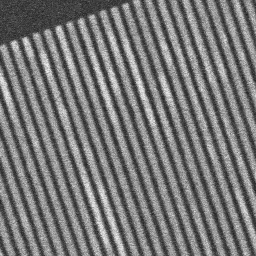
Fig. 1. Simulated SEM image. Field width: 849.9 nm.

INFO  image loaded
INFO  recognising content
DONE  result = parallel lines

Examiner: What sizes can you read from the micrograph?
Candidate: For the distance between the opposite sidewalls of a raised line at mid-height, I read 18.5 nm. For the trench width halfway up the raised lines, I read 21.2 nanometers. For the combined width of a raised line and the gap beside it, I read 38.9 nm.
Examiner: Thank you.